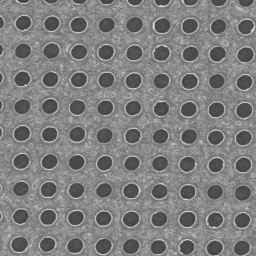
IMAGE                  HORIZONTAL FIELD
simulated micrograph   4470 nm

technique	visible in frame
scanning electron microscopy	a regular array of holes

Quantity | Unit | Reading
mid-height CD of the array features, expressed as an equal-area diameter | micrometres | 0.266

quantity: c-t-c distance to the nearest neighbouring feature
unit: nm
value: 477